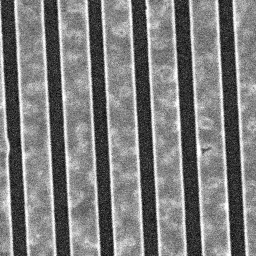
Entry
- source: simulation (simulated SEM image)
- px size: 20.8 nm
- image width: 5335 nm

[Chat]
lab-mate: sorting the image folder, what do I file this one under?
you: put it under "parallel lines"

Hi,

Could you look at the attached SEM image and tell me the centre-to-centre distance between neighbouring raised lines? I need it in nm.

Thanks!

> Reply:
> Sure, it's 907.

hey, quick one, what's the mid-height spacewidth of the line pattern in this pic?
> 330 nanometers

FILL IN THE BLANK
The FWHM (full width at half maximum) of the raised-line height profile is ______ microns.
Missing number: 0.588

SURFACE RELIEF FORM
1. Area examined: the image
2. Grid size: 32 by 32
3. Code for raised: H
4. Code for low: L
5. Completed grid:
LLHHHLLHHHHLLHHHLLHHHHLLHHHLLHHH
LLHHHLLHHHHLLHHHLLHHHHLLHHHLLHHH
LLHHHLLHHHHLLHHHLLHHHHLLHHHLLHHH
LLHHHLLHHHHLLHHHLLLHHHLLHHHLLHHH
LLHHHHLLHHHLLHHHLLLHHHLLHHHLLHHH
LLHHHHLLHHHLLHHHHLLHHHLLHHHLLHHH
LLHHHHLLHHHLLHHHHLLHHHLLHHHLLHHH
LLHHHHLLHHHLLHHHHLLHHHLLHHHLLLHH
LLHHHHLLHHHLLHHHHLLHHHLLHHHHLLHH
LLHHHHLLHHHLLHHHHLLHHHLLHHHHLLHH
LLHHHHLLHHHLLHHHHLLHHHLLHHHHLLHH
LLHHHHLLHHHLLHHHHLLHHHLLHHHHLLHH
HLLHHHLLHHHLLHHHHLLHHHLLHHHHLLHH
HLLHHHLLHHHHLHHHHLLHHHLLHHHHLLHH
HLLHHHLLHHHHLHHHHLLHHHLLHHHHLLHH
HLLHHHLLHHHHLHHHHLLHHHLLLHHHLLHH
HLLHHHLLHHHHLLHHHLLHHHLLLHHHLLHH
HLLHHHLLHHHHLLHHHLLHHHLLLHHHLLHH
HLLHHHLLHHHHLLHHHLLHHHHLLLLHLLHH
HLLHHHLLHHHHLLHHHLLHHHHLLLHHLLHH
HLLHHHLLHHHHLLHHHLLHHHHLLHHHLLHH
HLLHHHLLHHHHLLHHHLLHHHHLLHHHLLHH
HLLHHHLLHHHHLLHHHLLHHHHLLHHHLLHH
HLLHHHHLHHHHLLHHHLLLHHHLLHHHLLHH
HLLHHHHLLHHHLLHHHHLLHHHLLHHHLLHH
HLLHHHHLLHHHLLHHHHLLHHHLLHHHLLHH
HLLHHHHLLHHHLLHHHHLLHHHLLHHHLLLH
HLLHHHHLLHHHLLHHHHLLHHHLLHHHHLLH
HLLHHHHLLHHHLLHHHHLLHHHLLHHHHLLH
HLLHHHHLLHHHLLHHHHLLHHHLLHHHHLLH
HLLHHHHLLHHHLLHHHHLLHHHLLHHHHLLH
HHLHHHHLLHHHLLHHHHLLHHHLLHHHHLLH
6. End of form